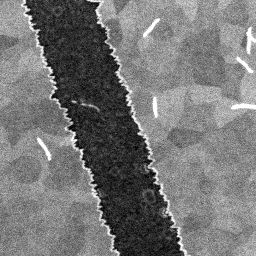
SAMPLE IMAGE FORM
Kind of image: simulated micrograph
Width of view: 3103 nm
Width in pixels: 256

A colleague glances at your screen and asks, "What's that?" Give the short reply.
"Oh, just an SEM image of one or a few lines or trenches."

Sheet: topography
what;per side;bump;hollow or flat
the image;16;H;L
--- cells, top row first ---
HHLLLLHHHHHHHHHH
HHLLLLHHHHHHHHHH
HHLLLLLHHHHHHHHH
HHHLLLLHHHHHHHHH
HHHLLLLHHHHHHHHH
HHHLLLLLHHHHHHHH
HHHHLLLLHHHHHHHH
HHHHLLLLHHHHHHHH
HHHHHLLLLHHHHHHH
HHHHHLLLLHHHHHHH
HHHHHLLLLHHHHHHH
HHHHHHLLLLHHHHHH
HHHHHHLLLLHHHHHH
HHHHHHLLLLLHHHHH
HHHHHHHLLLLHHHHH
HHHHHHHLLLLHHHHH